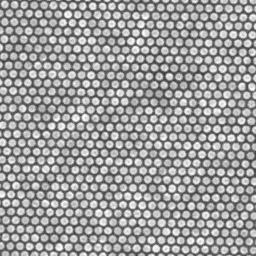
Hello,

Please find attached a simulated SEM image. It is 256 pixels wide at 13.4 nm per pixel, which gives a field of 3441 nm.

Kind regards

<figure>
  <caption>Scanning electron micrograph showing a regular array of raised bodies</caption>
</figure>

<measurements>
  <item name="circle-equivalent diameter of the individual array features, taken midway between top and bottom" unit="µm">0.0897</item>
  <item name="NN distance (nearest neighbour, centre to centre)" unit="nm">126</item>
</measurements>